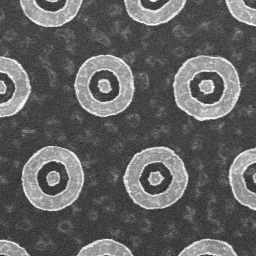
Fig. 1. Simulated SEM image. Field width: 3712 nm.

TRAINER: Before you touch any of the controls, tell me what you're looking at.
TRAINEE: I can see ring-shaped raised bodies with a dot in the middle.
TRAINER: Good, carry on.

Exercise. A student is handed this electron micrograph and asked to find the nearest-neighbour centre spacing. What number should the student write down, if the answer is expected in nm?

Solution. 1480